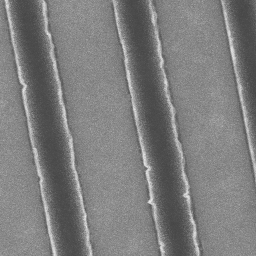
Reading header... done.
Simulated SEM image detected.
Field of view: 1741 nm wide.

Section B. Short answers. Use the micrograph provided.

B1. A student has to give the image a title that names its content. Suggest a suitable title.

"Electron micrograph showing one or a few lines or trenches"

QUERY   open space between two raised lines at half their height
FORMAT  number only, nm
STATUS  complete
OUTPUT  462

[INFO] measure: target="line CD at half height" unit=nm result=257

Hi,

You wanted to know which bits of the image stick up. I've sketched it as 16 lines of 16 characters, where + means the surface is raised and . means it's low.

+++....+++....++
.++....+++....++
.++.....++....++
.++.....++....++
.+++....++.....+
.+++....++.....+
..++....+++....+
..++....+++....+
..++.....++....+
..+++....++.....
..+++....++.....
...++....+++....
...++....+++....
...++.....++....
...+++....++....
...+++....++....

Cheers